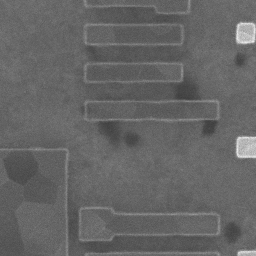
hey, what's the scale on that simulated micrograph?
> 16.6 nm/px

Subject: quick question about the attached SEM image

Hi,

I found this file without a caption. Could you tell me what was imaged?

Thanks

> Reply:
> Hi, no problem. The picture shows wiring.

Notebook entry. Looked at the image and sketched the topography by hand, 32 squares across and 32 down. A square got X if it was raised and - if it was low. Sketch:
-----------XXXXXXXXXXXXX--------
--------------------XXX---------
--------------------------------
-----------XXXXXXXXXXXX-------XX
-----------XXXXXXXXXXXX-------XX
------------XX--X-XX------------
--------------------------------
--------------------------------
-----------XXXXXXXXXXXX---------
-----------XXXXXXXXXXXX---------
--------------------------------
--------------------------------
--------------------------------
-----------XXXXXXXXXXXXXXXX-----
-----------XXXXXXXXXXXXXXXX-----
--------------------------------
--------------------------------
------------------------------XX
------------------------------XX
XXXXXXXX----------------------XX
XXXXXXXX------------------------
XXXXXXXX------------------------
XXXXXXXX------------------------
XXXXXXXX------------------------
XXXXXXXX------------------------
XXXXXXXX------------------------
XXXXXXXX--XXXX------------------
XXXXXXXX--XXXXXXXXXXXXXXXXX-----
XXXXXXXX--XXXXXXXXXXXXXXXXX-----
XXXXXXXX--XXXX------------------
XXXXXXXX------------------------
XXXXXXXX----------------------XX